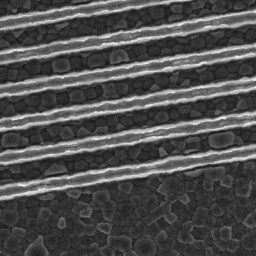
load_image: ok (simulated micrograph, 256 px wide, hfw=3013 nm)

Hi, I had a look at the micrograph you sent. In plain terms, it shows parallel lines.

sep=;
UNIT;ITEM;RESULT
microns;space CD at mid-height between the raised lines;0.263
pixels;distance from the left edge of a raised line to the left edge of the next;33.2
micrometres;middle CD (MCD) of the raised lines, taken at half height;0.137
